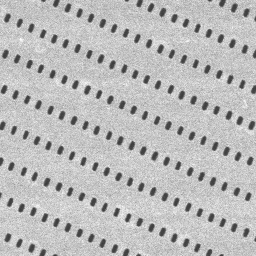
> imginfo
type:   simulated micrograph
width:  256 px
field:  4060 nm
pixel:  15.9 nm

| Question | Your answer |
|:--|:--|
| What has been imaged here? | a regular array of holes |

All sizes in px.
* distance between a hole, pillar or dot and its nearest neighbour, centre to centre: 12.5